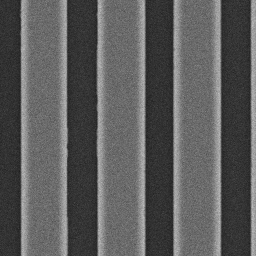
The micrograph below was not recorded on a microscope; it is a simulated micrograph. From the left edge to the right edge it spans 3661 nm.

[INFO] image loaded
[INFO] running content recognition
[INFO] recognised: lines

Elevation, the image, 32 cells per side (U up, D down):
DDDUUUUUDDDDUUUUUUDDDDUUUUUDDDDU
DDDUUUUUDDDDUUUUUUDDDDUUUUUDDDDU
DDDUUUUUDDDDUUUUUUDDDDUUUUUDDDDU
DDDUUUUUDDDDUUUUUUDDDDUUUUUDDDDU
DDDUUUUUDDDDUUUUUUDDDDUUUUUDDDDU
DDDUUUUUDDDDUUUUUUDDDDUUUUUUDDDU
DDDUUUUUDDDDUUUUUUDDDDUUUUUUDDDU
DDDUUUUUDDDDUUUUUUDDDDUUUUUDDDDU
DDDUUUUUDDDDUUUUUUDDDDUUUUUUDDDU
DDDUUUUUDDDDUUUUUUDDDDUUUUUUDDDU
DDDUUUUUDDDDUUUUUUDDDDUUUUUUDDDU
DDDUUUUUDDDDUUUUUUDDDDUUUUUUDDDU
DDDUUUUUDDDDUUUUUUDDDDUUUUUUDDDU
DDDUUUUUDDDDUUUUUUDDDDUUUUUUDDDU
DDDUUUUUDDDDUUUUUUDDDDUUUUUUDDDU
DDDUUUUUDDDDUUUUUUDDDDUUUUUUDDDD
DDDUUUUUDDDDUUUUUUDDDDUUUUUUDDDD
DDDUUUUUDDDDUUUUUUDDDDUUUUUUDDDD
DDDUUUUUDDDDUUUUUUDDDDUUUUUUDDDD
DDDUUUUUDDDDUUUUUUDDDDUUUUUUDDDD
DDDUUUUUDDDDUUUUUUDDDDUUUUUUDDDD
DDDUUUUUDDDDUUUUUUDDDDUUUUUUDDDU
DDDUUUUUDDDDUUUUUUDDDDUUUUUUDDDU
DDDUUUUUDDDDUUUUUUDDDDUUUUUUDDDU
DDDUUUUUDDDDUUUUUUDDDDUUUUUUDDDU
DDDUUUUUDDDDUUUUUUDDDDUUUUUUDDDU
DDDUUUUUDDDDUUUUUUDDDDUUUUUUDDDU
DDDUUUUUDDDDUUUUUUDDDDUUUUUUDDDU
DDDUUUUUDDDDUUUUUUDDDDUUUUUUDDDU
DDDUUUUUDDDDUUUUUUDDDDUUUUUUDDDU
DDDUUUUUDDDDUUUUUUDDDDUUUUUUDDDU
DDDUUUUUDDDDUUUUUUDDDDUUUUUUDDDU